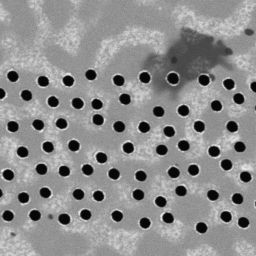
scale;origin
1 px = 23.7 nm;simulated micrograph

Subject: a regular array of holes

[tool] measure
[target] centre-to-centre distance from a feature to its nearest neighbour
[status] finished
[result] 21.5 pixels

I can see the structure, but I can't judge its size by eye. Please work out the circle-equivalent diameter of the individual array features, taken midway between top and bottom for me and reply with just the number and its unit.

0.271 µm